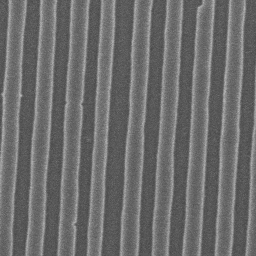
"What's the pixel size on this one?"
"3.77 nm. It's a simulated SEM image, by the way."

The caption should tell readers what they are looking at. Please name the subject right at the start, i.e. parallel lines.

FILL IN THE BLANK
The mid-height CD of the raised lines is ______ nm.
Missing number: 60.7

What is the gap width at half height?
57.4 nanometres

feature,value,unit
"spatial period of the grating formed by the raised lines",31.4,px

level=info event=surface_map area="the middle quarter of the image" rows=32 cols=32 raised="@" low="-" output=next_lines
-@@@@----@@@-----@@@@----@@@@---
-@@@@---@@@@-----@@@@----@@@@---
-@@@@---@@@@-----@@@@----@@@@---
-@@@@----@@@-----@@@@----@@@@---
-@@@@----@@@-----@@@@----@@@----
-@@@@---@@@------@@@@----@@@----
-@@@@---@@@------@@@-----@@@----
-@@@@---@@@------@@@----@@@@@---
-@@@@---@@@------@@@----@@@@----
-@@@@---@@@------@@@----@@@@----
-@@@@---@@@------@@@----@@@@----
@@@@----@@@------@@@----@@@@----
@@@@----@@@------@@@----@@@@----
@@@@----@@@-----@@@@----@@@@----
@@@@----@@@-----@@@@----@@@@----
@@@@----@@@-----@@@@----@@@@----
@@@@----@@@-----@@@@----@@@@----
@@@@----@@@-----@@@@----@@@@----
@@@@----@@@-----@@@@----@@@@----
@@@@----@@@-----@@@@----@@@-----
@@@@----@@@-----@@@@----@@@-----
@@@@---@@@@-----@@@@----@@@-----
@@@@---@@@------@@@@----@@@----@
@@@@---@@@-----@@@@@---@@@@----@
@@@@---@@@-----@@@@@---@@@@----@
@@@@---@@@-----@@@@@---@@@@----@
@@@@---@@@-----@@@@@---@@@@----@
@@@----@@@-----@@@@----@@@@----@
@@@----@@@-----@@@@----@@@@----@
@@@----@@@-----@@@@----@@@@----@
@@@----@@@-----@@@@----@@@@----@
@@@----@@@-----@@@@----@@@@----@